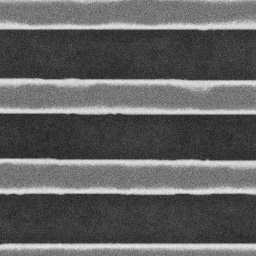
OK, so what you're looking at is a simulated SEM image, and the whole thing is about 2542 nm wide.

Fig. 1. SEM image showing lines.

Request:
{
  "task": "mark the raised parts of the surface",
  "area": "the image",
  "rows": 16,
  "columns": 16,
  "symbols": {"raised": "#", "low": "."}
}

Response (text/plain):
################
################
................
................
................
################
################
................
................
................
################
################
................
................
................
################